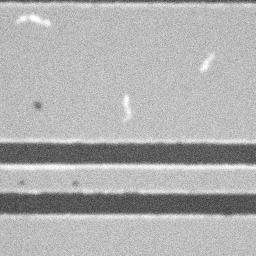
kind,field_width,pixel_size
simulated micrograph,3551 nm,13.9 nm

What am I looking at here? lines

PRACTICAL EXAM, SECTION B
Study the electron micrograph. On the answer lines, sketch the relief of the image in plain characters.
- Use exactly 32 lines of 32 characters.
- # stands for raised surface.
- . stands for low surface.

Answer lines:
###..#####....#..........#......
################################
################################
################################
################################
################################
################################
################################
################################
################################
################################
################################
################################
################################
################################
################################
################################
################################
................................
................................
................................
################################
################################
################################
................................
................................
................................
################################
################################
################################
################################
################################